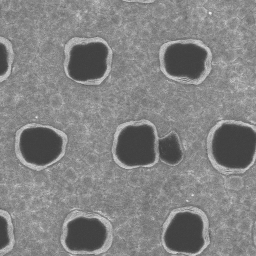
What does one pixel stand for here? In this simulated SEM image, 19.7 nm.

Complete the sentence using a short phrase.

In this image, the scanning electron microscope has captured raised bodies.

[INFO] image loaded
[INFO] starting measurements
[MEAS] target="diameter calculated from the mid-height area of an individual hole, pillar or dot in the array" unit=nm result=908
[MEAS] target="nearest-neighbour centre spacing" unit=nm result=1920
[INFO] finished